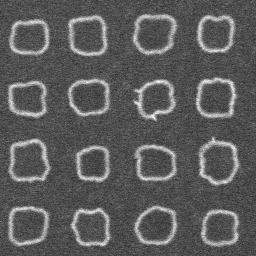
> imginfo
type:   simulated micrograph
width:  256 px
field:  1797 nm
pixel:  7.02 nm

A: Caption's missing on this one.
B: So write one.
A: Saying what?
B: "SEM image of a regular array of raised bodies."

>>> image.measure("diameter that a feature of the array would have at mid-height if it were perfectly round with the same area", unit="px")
37.9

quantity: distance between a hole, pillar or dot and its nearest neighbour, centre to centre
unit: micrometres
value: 0.435